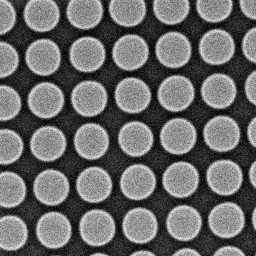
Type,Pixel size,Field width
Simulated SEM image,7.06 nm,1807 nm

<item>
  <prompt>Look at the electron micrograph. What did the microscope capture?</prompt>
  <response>an array of small figures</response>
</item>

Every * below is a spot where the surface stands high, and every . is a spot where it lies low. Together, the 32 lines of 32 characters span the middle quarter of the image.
...******.....*****.......***...
....***.........................
................................
..........................****..
......*.......******.....******.
...******.....*******...********
...*******...********...********
..********...********...********
..*********..*********..********
..*********..********...********
..********....*******....******.
...*******.....****........**...
....****........................
................................
..........................*****.
.....****......*****.....*******
....******....*******....*******
...********...********..********
...********...********..********
...********...********..********
...********...********...*******
...********....******.....*****.
....******......****............
......**........................
................................
.................***.......*****
......****......*****.....******
....*******....*******...*******
....*******...*********..*******
*..*********..*********..*******
*..*********..*********..*******
*..*********..********....******